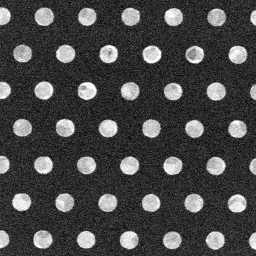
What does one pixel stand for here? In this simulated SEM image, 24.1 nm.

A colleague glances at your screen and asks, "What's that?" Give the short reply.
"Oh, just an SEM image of a regular array of raised bodies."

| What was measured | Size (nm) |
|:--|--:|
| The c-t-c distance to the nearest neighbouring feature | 1030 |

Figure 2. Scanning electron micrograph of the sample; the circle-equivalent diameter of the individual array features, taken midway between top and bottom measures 416 nanometers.